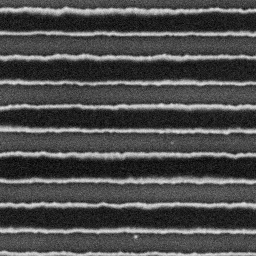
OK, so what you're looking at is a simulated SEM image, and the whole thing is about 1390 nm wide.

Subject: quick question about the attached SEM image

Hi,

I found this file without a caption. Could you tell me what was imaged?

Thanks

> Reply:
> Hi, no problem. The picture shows lines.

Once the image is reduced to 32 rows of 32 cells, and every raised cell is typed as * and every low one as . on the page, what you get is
................................
********************************
********************************
********************************
................................
................................
................................
********************************
********************************
********************************
.........................*....*.
................................
................................
********************************
********************************
********************************
...........................**..*
................................
................................
********************************
********************************
********************************
********************************
................................
................................
**..******..**..**..*****.....*.
********************************
********************************
********************************
................................
................................
*...............................